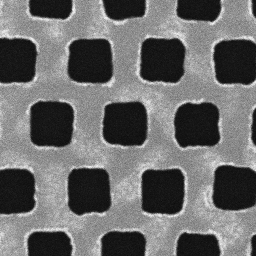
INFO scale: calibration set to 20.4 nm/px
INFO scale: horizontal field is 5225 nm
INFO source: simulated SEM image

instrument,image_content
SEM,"holes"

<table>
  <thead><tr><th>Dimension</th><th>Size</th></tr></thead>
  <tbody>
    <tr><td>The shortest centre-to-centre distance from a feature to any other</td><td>1.47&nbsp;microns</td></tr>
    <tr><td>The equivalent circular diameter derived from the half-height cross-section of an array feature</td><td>0.993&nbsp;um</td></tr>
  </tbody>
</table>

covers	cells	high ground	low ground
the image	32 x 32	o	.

oooo.....oooo.....oooo......ooo.
oooo.....oooo.....oooo......oooo
oooooooooooooo.oooooooo....ooooo
oooooooooooooooooooooooooooooooo
oooooooooooooooooooooooooooooooo
....ooooo.....oooo.....oooo.....
.....oooo.....oooo.....oooo.....
.....oooo.....oooo.....oooo.....
....oooo......oooo.....oooo.....
....ooooo.....oooo.....oooo.....
oooooooooooooooooooooooooooo...o
oooooooooooooooooooooooooooooooo
oooooooooooooooooooooooooooooooo
oooo.....oooo.....oooo.....ooooo
oooo.....oooo.....oooo.....oooo.
oooo.....oooo......ooo.....oooo.
oooo.....oooo.....oooo.....oooo.
oooo.....oooo.....oooo.....oooo.
oooooooooooooooooooooooooooooooo
oooooooooooooooooooooooooooooooo
oooooooooooooooooooooooooooooooo
....ooooo....ooooo.....oooo.....
....oooo......oooo.....oooo.....
....oooo......oooo.....oooo.....
....ooooo.....oooo.....oooo.....
....ooooo.....oooo.....oooo.....
....ooooo....ooooo....oooooooooo
oooooooooooooooooooooooooooooooo
oooooooooooooooooooooooooooooooo
oooo.....oooo.....oooo.....ooooo
ooo......oooo.....oooo.....oooo.
ooo......oooo.....oooo......ooo.